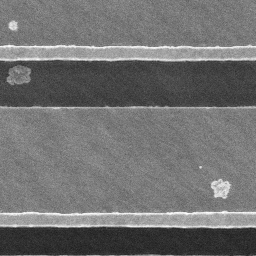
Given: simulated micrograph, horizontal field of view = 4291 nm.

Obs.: lines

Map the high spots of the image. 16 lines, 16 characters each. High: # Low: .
################
################
################
################
................
................
................
################
################
################
################
################
################
################
................
................